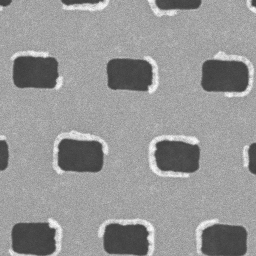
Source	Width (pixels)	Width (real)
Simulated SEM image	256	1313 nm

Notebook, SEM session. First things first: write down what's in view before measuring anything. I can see holes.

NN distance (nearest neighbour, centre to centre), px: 94